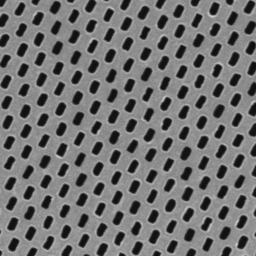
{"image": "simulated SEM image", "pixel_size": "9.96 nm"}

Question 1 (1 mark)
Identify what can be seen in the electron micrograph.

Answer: a regular array of holes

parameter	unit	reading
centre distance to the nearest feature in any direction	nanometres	198